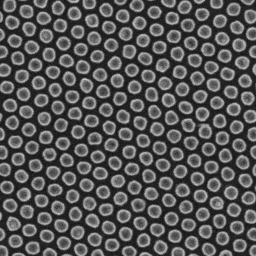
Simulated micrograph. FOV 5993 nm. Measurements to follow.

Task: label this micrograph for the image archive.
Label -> a regular array of raised bodies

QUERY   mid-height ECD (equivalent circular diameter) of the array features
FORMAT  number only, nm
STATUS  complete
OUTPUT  288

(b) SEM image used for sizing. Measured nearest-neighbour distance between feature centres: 408 nanometres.